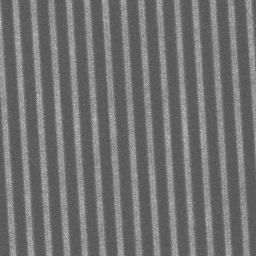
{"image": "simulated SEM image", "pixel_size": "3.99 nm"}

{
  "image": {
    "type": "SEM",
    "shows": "parallel lines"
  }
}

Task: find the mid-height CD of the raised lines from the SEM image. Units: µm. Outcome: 0.0274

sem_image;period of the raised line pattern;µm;0.0714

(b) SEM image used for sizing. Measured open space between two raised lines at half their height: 43.8 nanometers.